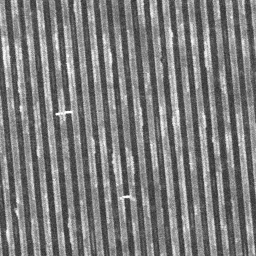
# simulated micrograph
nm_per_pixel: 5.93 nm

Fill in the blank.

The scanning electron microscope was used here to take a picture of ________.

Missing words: parallel lines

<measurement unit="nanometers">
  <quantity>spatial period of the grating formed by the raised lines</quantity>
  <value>74.5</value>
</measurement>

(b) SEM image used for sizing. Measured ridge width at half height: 33.2 nanometers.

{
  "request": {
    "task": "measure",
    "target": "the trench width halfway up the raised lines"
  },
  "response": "38.4 nm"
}